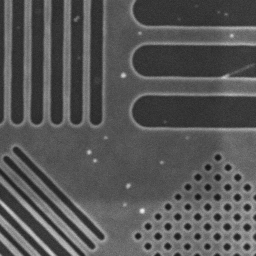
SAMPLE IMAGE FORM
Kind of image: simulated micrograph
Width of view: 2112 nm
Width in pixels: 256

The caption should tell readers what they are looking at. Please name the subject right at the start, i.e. groups of lines, slits or small figures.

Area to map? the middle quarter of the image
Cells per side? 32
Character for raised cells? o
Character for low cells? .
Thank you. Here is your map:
o....o....ooooooo...............
o....o....oooooooo..............
o....o....ooooooooo.............
o....o....ooooooooooooooooooooo.
o....o....oooooooooooooooooooooo
o....o....oooooooooooooooooooooo
o....o....oooooooooooooooooooooo
o....o....oooooooooooooooooooooo
o....o....ooooooooo.............
o....o....oooooooo..............
o....o....ooooooo...............
o....o....ooooooo...............
o....o....ooooooo...............
o....o....ooooooo...............
oo..ooo..ooooooooo..............
ooooooooooooooooooo.............
oooooooooooooooooooooooooooooooo
oooooooooooooooooooooooooooooooo
oooooooooooooooooooooooooooooooo
oooooooooooooooooooooooooooooooo
oooooooooooooooooooooooooooooooo
oooooooooooooooooooooooooooooooo
oooooooooooooooooooooooooooooooo
oooooooooooooooooooooooooooooooo
oooooooooooooooooooooooooooooooo
oooooooooooooooooooooooooooooooo
oooooooooooooooooooooooooooooooo
oooooooooooooooooooooooooooooooo
oooooooooooooooooooooooooooooooo
oooooooooooooooooooooooooooooooo
oooooooooooooooooooooooooooooo..
oooooooooooooooooooooooooooooooo